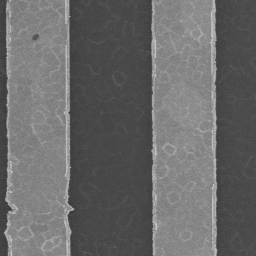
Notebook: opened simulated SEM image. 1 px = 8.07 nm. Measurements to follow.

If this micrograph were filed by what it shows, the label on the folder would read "one or a few lines or trenches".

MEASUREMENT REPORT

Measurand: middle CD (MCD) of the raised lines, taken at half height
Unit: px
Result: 61.6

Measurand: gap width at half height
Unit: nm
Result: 672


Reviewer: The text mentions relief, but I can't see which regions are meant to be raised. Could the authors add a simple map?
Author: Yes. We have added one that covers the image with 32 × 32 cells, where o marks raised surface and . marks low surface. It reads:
.oooooooo..........oooooooo.....
.oooooooo..........oooooooo.....
.oooooooo..........oooooooo.....
.oooooooo..........oooooooo.....
.oooooooo..........oooooooo.....
.oooooooo..........oooooooo.....
.oooooooo..........oooooooo.....
.oooooooo..........oooooooo.....
.oooooooo..........oooooooo.....
.oooooooo..........oooooooo.....
.oooooooo..........oooooooo.....
.oooooooo..........oooooooo.....
.oooooooo..........oooooooo.....
.oooooooo..........oooooooo.....
.oooooooo..........oooooooo.....
.oooooooo..........oooooooo.....
.oooooooo..........oooooooo.....
.oooooooo..........oooooooo.....
.oooooooo..........oooooooo.....
.oooooooo..........oooooooo.....
.oooooooo..........oooooooo.....
.oooooooo..........oooooooo.....
.oooooooo..........oooooooo.....
.ooooooo...........oooooooo.....
.ooooooo...........oooooooo.....
.ooooooo...........oooooooo.....
.oooooooo..........oooooooo.....
.ooooooo...........oooooooo.....
.oooooooo..........oooooooo.....
.oooooooo..........oooooooo.....
.oooooooo..........oooooooo.....
.oooooooo..........oooooooo.....